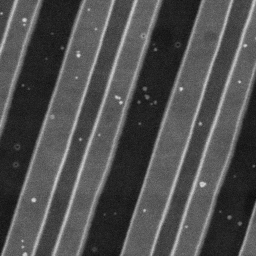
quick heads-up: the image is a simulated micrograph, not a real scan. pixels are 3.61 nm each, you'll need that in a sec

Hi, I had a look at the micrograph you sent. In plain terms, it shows lines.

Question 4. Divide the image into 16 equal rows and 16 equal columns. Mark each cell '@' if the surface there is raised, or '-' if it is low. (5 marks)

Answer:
@@---@@@@@---@@@
@@---@@@@---@@@@
@@--@@@@@---@@@@
@---@@@@@---@@@@
@---@@@@@--@@@@@
@--@@@@@---@@@@@
---@@@@@---@@@@-
---@@@@@--@@@@@-
--@@@@@---@@@@@-
--@@@@@---@@@@--
--@@@@@--@@@@@--
--@@@@---@@@@@--
-@@@@@---@@@@---
-@@@@@--@@@@@---
-@@@@---@@@@@--@
@@@@@---@@@@---@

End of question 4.